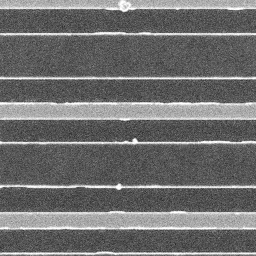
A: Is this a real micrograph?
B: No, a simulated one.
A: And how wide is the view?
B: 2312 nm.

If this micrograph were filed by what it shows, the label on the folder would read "lines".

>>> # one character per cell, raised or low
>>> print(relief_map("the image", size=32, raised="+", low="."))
++++++++++++++++++++++++++++++++
................................
................................
................................
++++++++++++++++++++++++++++++++
++++++++++++++++++++++++++++++++
++++++++++++++++++++++++++++++++
++++++++++++++++++++++++++++++++
++++++++++++++++++++++++++++++++
++++++++++++++++++++++++++++++++
................................
................................
................................
++++++++++++++++++++++++++++++++
++++++++++++++++++++++++++++++++
................................
................................
................................
++++++++++++++++++++++++++++++++
++++++++++++++++++++++++++++++++
++++++++++++++++++++++++++++++++
++++++++++++++++++++++++++++++++
++++++++++++++++++++++++++++++++
..............++................
................................
................................
................................
++++++++++++++++++++++++++++++++
++++++++++++++++++++++++++++++++
................................
................................
................................